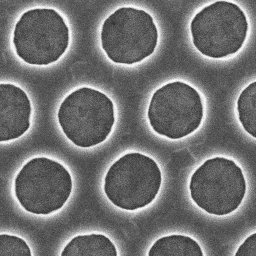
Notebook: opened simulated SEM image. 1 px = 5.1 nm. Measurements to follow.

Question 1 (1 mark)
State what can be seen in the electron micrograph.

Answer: a regular array of holes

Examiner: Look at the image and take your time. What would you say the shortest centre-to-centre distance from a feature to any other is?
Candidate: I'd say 430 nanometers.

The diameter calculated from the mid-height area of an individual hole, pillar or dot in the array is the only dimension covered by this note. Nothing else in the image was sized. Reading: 57.5 px